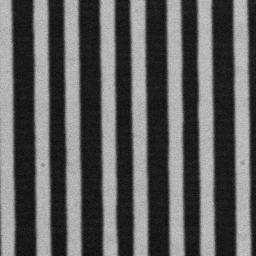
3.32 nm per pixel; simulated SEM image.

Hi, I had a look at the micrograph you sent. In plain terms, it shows wiring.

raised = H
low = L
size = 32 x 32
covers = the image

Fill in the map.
HHLLHHLLHHLLHHLLHHLLLHHLLHHLLHHL
HHLLHHLLHHLLHHLLHHLLLHHLLHHLLHHL
HHLLHHLLHHLLHHLLHHLLLHHLLHHLLHHL
HHLLHHLLHHLLHHLLHHLLLHHLLHHLLHHL
HHLLHHLLHHLLHHLLHHLLLHHLLHHLLHHL
HHLLHHLLHHLLHHLLHHLLLHHLLHHLLHHL
HHLLHHLLHHLLHHLLHHLLLHHLLHHLLHHL
HHLLHHLLHHLLHHLLHHLLLHHLLHHLLHHL
HHLLHHLLHHLLHHLLHHLLLHHLLHHLLHHL
HHLLHHLLHHLLLHLLHHLLLHHLLHHLLHHL
HHLLHHLLHHLLLHLLHHLLLHHLLHHLLHHL
HHLLHHLLHHLLLHHLHHLLLHHLLHHLLHHL
HHLLHHLLHHLLLHHLHHLLLHHLLHHLLHHL
HHLLHHLLHHLLLHHLHHLLLHHLLHHLLHHL
HHLLHHLLHHLLLHHLHHLLLHHLLHHLLHHL
HHLLHHLLHHLLLHHLHHLLLHHLLHHLLHHL
HHLLHHLLHHLLLHHLHHLLLHHLLHHLLHHL
HHLLHHLLHHLLLHHLHHLLLHHLLHHLLHHL
HHLLHHLLHHLLLHHLLHLLLHHLLHHLLHHL
HHLLHHLLHHLLLHHLLHLLLHHLLHHLLHHL
HHLLHHLLHHLLLHHLLHLLLHHLLHHLLHHL
HHLLHHLLHHLLLHHLLHHLLHHLLHHLLHHL
HHLLHHLLHHLLLHHLLHHLLHHLLHHLLHHL
HHLLHHLLHHLLLHHLLHHLLHHLLHHLLHHL
HHLLHHLLHHLLLHHLLHHLLHHLLHHLLHHL
HHLLHHLLHHLLLHHLLHHLLHHLLHHLLHHL
HHLLHHLLHHLLLHHLLHHLLHHLLHHLLHHL
HHLLHHLLHHLLLHHLLHHLLHHLLHHLLHHL
HHLLHHLLHHLLLHHLLHHLLHHLLHHLLHHL
HHLLHHLLHHLLLHHLLHHLLHHLLHHLLHHL
HHLLHHLLHHLLLHHLLHHLLHHLLHHLLHHL
HHLLHHLLHHLLLHHLLHHLLHHLLHHLLHHL